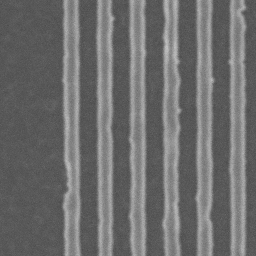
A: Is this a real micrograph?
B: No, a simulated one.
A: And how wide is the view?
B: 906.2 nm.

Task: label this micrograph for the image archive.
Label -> parallel lines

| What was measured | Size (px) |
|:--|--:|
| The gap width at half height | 21.6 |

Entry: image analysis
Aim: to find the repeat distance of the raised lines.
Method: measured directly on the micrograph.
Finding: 0.117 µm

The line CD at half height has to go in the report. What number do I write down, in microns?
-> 0.0416